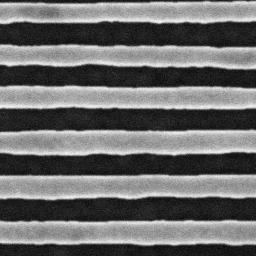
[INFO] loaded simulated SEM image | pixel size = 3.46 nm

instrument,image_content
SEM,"lines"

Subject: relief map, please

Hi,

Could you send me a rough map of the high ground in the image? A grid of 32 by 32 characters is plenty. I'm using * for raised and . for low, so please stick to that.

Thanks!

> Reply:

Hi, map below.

******......********************
********************************
********************************
................................
................................
................................
********************************
********************************
............................****
................................
................................
********************************
********************************
.......................***..**..
................................
................................
..******************************
********************************
********************************
................................
................................
................................
********************************
********************************
*******************...****..****
................................
................................
................................
********************************
********************************
.....................**.....**..
................................